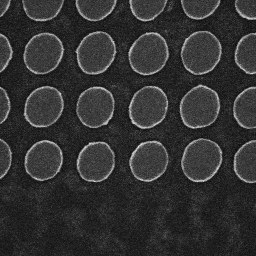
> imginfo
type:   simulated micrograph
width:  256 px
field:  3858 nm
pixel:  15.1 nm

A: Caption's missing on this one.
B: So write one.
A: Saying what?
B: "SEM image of a regular array of raised bodies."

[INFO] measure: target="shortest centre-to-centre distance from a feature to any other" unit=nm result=787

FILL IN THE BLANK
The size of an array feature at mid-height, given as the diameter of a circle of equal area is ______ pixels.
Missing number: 40.2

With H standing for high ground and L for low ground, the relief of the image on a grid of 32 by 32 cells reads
HLLHHHHHLLHHHHLLHHHHHLLHHHHLLHHH
HLLHHHHLLLHHHHLLLHHHLLLHHHHLLLHH
LLLLLHLLLLLLLLLLLLHLLLLLLLLLLLLL
LLLLLLLLLLLLLLLLLLLLLLLLLLLLLLLL
LLLLHHHLLLLHHHLLLLHHLLLLHHHLLLLH
HLLHHHHHLLHHHHLLLHHHHLLHHHHLLLHH
HLLHHHHHLLHHHHLLHHHHHLLHHHHHLHHH
HLLHHHHLLLHHHHLLHHHHHLLHHHHLLHHH
HLLLHHHLLLHHHLLLLHHHLLLHHHHLLLHH
LLLLLLLLLLLLLLLLLLLLLLLLLLLLLLLL
LLLLLLLLLLLLLLLLLLLLLLLLLLLLLLLL
HLLLHHHLLLHHHHLLLHHHLLLLHHHLLLHH
HLLHHHHHLLHHHHLLHHHHHLLHHHHLLLHH
HLLHHHHHLLHHHHLLHHHHHLLHHHHLLHHH
HLLHHHHLLLHHHHLLHHHHHLLHHHHLLHHH
LLLLHHLLLLLHHLLLLHHHLLLHHHLLLLHH
LLLLLLLLLLLLLLLLLLLLLLLLLLLLLLLL
LLLLLLLLLLLLLLLLLLLLLLLLLHLLLLLL
HLLLHHHLLLHHHHLLLHHHHLLHHHHLLLHH
HLLHHHHHLLHHHHLLHHHHHLLHHHHHLHHH
HLLHHHHHLLHHHHLLHHHHHLLHHHHHLHHH
HLLLHHHLLLHHHHLLLHHHLLLHHHHLLHHH
LLLLLHLLLLLHHLLLLLHLLLLLHHLLLLHH
LLLLLLLLLLLLLLLLLLLLLLLLLLLLLLLL
LLLLLLLLLLLLLLLLLLLLLLLLLLLLLLLL
LLLLLLLLLLLLLLLLLLLLLLLLLLLLLLLL
LLLLLLLLLLLLLLLLLLLLLLLLLLLLLLLL
LLLLLLLLLLLLLLLLLLLLLLLLLLLLLLLL
LLLLLLLLLLLLLLLLLLLLLLLLLLLLLLLL
LLLLLLLLLLLLLLLLLLLLLLLLLLLLLLLL
LLLLLLLLLLLLLLLLLLLLLLLLLLLLLLLL
LLLLLLLLLLLLLLLLLLLLLLLLLLLLLLLL